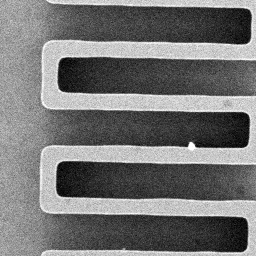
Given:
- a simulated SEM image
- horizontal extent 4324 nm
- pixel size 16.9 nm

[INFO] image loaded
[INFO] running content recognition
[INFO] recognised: groups of lines, slits or small figures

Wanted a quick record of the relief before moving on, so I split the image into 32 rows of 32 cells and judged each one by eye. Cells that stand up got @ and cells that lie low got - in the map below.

-----------@@@@@@@@@@@@@@@@@@@@@
-------------------------------@
-------------------------------@
-------------------------------@
-------------------------------@
------@@@@@@@@@@@@@@@@@@@@@----@
-----@@@@@@@@@@@@@@@@@@@@@@@@@@@
-----@@@------------------------
-----@@-------------------------
-----@@-------------------------
-----@@-------------------------
-----@@@------------------------
-----@@@@@@@@@@@@@@@@@@@@@@@@@@@
------@@@@@@@@@@@@@@@@@@@@@@@@@@
-------------------------------@
-------------------------------@
-------------------------------@
-------------------------------@
------@@@@@@@@@@@@@@@@@@@-----@@
-----@@@@@@@@@@@@@@@@@@@@@@@@@@@
-----@@-------------------------
-----@@-------------------------
-----@@-------------------------
-----@@-------------------------
-----@@-------------------------
-----@@@@@@@@@@@@@@@@@@@@@@@@@@@
------@@@@@@@@@@@@@@@@@@@@@@@@@@
-------------------------------@
-------------------------------@
-------------------------------@
-------------------------------@
------@@@@@@@@@@@@@-----------@@